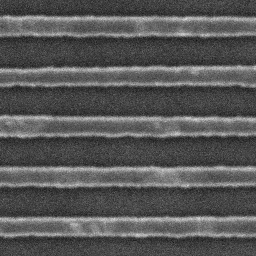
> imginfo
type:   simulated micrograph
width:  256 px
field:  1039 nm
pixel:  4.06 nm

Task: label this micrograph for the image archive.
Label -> lines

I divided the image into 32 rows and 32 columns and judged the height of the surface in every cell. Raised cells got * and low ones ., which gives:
................................
................................
********************************
********************************
*........**...***........*......
................................
................................
................................
...................**..*********
********************************
********************************
................................
................................
................................
................................
********************************
********************************
................................
................................
................................
................................
********************************
********************************
................................
................................
................................
................................
********************************
********************************
......................*.........
................................
................................